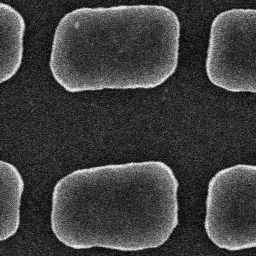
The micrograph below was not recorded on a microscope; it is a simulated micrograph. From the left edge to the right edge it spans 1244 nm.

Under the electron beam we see raised bodies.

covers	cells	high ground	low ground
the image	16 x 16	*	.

*......***......
*...*******..***
*..********..***
*..********..***
*..********..***
....****......**
................
................
................
................
*.....****....**
*...*******..***
*..********..***
*..********..***
*..********..***
.......**.......